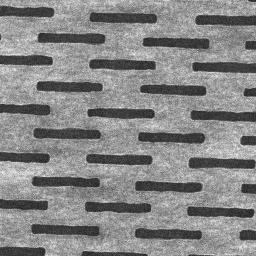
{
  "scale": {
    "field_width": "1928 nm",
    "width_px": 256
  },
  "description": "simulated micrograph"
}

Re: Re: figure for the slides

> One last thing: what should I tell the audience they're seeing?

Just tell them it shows a regular array of holes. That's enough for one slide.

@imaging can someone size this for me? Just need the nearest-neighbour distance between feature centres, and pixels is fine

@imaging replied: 47.3